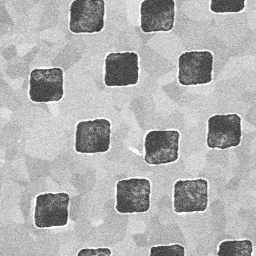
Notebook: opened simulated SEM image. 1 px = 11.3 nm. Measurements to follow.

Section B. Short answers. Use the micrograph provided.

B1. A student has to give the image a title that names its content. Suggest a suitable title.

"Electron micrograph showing a regular array of holes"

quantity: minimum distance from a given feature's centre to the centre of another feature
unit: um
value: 0.782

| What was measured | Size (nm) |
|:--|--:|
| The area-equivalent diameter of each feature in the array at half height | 424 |